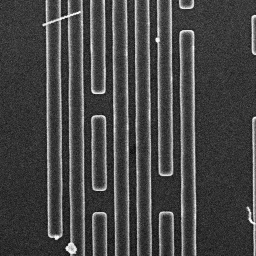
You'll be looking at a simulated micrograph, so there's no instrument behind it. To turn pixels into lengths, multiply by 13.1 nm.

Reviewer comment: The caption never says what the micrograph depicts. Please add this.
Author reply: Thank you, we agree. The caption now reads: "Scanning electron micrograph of groups of lines, slits or small figures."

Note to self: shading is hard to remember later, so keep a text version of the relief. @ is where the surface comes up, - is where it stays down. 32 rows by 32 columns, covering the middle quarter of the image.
-@@@@--@@@--@@@@--@@@---@@@--@@@
-@@@@--@@@--@@@@--@@@---@@@--@@@
-@@@@--@@@--@@@@--@@@---@@@--@@@
-@@@@--@@@--@@@@--@@@---@@@--@@@
-@@@@--@@@---@@@--@@@---@@@--@@@
-@@@@--@@@---@@@--@@@---@@@--@@@
-@@@@--@@@---@@@--@@@---@@@--@@@
-@@@@--------@@@--@@@---@@@--@@@
-@@@@--------@@@--@@@---@@@--@@@
-@@@@--------@@@--@@@---@@@--@@@
-@@@@--------@@@--@@@---@@@--@@@
-@@@@--------@@@--@@@---@@@--@@@
-@@@@--------@@@--@@@---@@@---@@
-@@@@--@@@---@@@--@@@---@@@---@@
-@@@@--@@@---@@@--@@@---@@@---@@
-@@@@--@@@---@@@--@@@---@@@---@@
-@@@@--@@@---@@@--@@@---@@@---@@
-@@@@--@@@---@@@--@@@---@@@---@@
-@@@@--@@@---@@@--@@@---@@@---@@
-@@@@--@@@---@@@--@@@---@@@---@@
-@@@@--@@@---@@@--@@@@--@@@---@@
-@@@@--@@@---@@@--@@@@--@@@---@@
--@@@--@@@---@@@--@@@@--@@@---@@
--@@@--@@@---@@@--@@@@--@@@---@@
--@@@--@@@---@@@--@@@---@@@---@@
--@@@--@@@---@@@--@@@---@@@---@@
--@@@--@@@---@@@--@@@---@@@---@@
--@@@--@@@---@@@--@@@---@@@---@@
--@@@--@@@---@@@--@@@---------@@
--@@@--@@@---@@@--@@@@--------@@
--@@@--@@@---@@@--@@@@--------@@
--@@@---@@---@@@--@@@@--------@@